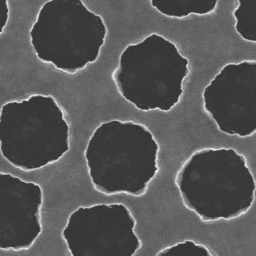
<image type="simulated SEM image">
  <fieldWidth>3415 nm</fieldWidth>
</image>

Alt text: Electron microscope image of holes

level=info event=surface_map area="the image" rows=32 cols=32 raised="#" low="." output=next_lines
.#####....#########........###..
.####......#########......###...
.####........#################..
####.........#################..
####.........######.##########..
####.........####.....##########
#####.......###.......##########
######......###........#########
########..#####........#####....
###############........####.....
###############........###......
###############........###......
###....#########......####......
.......##########..#.#####......
........###################.....
........#####....##########.....
........####.......#########...#
........###........#############
........###.........############
#.......###........#####......##
##....#####........####........#
###########........####........#
...#########.......###..........
.....#######......####..........
.....##################.........
.....##################........#
.....####.......#########.....##
.....####........###############
.....###.........###############
.....###.........###############
....####.........######.########
#########........###......######